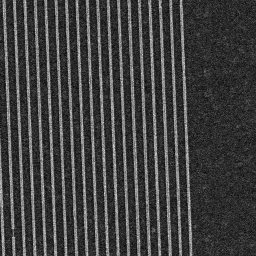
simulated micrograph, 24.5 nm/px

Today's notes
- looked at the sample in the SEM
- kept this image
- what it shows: parallel lines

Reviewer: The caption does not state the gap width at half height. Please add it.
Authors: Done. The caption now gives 8.87 px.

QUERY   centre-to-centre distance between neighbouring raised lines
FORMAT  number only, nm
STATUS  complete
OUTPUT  255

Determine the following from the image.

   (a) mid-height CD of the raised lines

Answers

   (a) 0.0336 micrometres